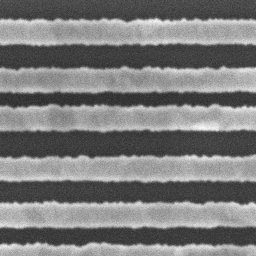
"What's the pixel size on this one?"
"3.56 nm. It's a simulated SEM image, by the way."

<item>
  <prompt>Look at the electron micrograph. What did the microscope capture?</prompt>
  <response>lines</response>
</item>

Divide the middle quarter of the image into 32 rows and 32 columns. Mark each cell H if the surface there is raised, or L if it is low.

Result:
LLLLLLLLLLLLLLLLLLLLLLLLLLLLLLLL
HHHHHHHHHHHHHHHHHHHHHHHHHHHHHHHH
HHHHHHHHHHHHHHHHHHHHHHHHHHHHHHHH
HHHHHHHHHHHHHHHHHHHHHHHHHHHHHHHH
HHHHHHHHHHHHHHHHHHHHHHHHHHHHHHHH
HHHHHHHHHHHHHHHHHHHHHHHHHHHHHHHH
HHHHHHHHHHHHHHHHHHHHHHHHHHHHHHHH
LLLLLLLLLLLLLLLLLLLLLLLLLLLLLLLL
LLLLLLLLLLLLLLLLLLLLLLLLLLLLLLLL
LLLLLLLLLLLLLLLLLLLLLLLLLLLLLLLL
HLLLHHLLHHHLLLLLLLLLLLLLLLHHLLHL
HHHHHHHHHHHHHHHHHHHHHHHHHHHHHHHH
HHHHHHHHHHHHHHHHHHHHHHHHHHHHHHHH
HHHHHHHHHHHHHHHHHHHHHHHHHHHHHHHH
HHHHHHHHHHHHHHHHHHHHHHHHHHHHHHHH
HHHHHHHHHHHHHHHHHHHHHHHHHHHHHHHH
HHLLLLLLHHHLLLLLLLLLLLHHLLLLLLLL
LLLLLLLLLLLLLLLLLLLLLLLLLLLLLLLL
LLLLLLLLLLLLLLLLLLLLLLLLLLLLLLLL
LLLLLLLLLLLLLLLLLLLLLLLLLLLLLLLL
LLLLLLLLLLLLLLLLLLLLLLLLLLLLLLLL
LLLLLLLLLLLLLLLLLLLLLLLLLLLLLLLL
LLLLLLLLLLLLLLLLLLLLLLLLLLLLLLLL
HHLHHHLLHHHHHHHHHHHHHHHHHHHHHHHH
HHHHHHHHHHHHHHHHHHHHHHHHHHHHHHHH
HHHHHHHHHHHHHHHHHHHHHHHHHHHHHHHH
HHHHHHHHHHHHHHHHHHHHHHHHHHHHHHHH
HHHHHHHHHHHHHHHHHHHHHHHHHHHHHHHH
HHHHHHHHHHHHHHHHHHHHHHHHHHHHHHHH
LLLLLLLLLLLLLLLLLLLLLLLLLLLLLLLL
LLLLLLLLLLLLLLLLLLLLLLLLLLLLLLLL
LLLLLLLLLLLLLLLLLLLLLLLLLLLLLLLL